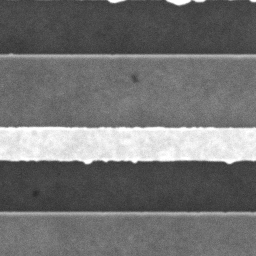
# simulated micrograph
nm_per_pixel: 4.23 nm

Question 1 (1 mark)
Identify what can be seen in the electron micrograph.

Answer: lines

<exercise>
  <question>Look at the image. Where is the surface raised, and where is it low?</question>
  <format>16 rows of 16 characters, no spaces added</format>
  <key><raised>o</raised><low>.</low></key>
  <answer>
................
................
................
oooooooooooooooo
oooooooooooooooo
oooooooooooooooo
oooooooooooooooo
oooooooooooooooo
oooooooooooooooo
oooooooooooooooo
................
................
................
oooooooooooooooo
oooooooooooooooo
oooooooooooooooo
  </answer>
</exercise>